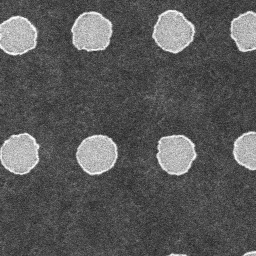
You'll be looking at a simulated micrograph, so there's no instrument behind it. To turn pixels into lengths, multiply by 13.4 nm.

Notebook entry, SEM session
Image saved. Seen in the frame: holes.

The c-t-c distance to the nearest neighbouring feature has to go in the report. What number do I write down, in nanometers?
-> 1060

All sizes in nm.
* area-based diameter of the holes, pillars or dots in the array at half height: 504